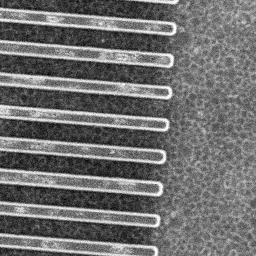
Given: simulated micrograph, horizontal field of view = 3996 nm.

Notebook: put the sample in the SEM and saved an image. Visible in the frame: parallel lines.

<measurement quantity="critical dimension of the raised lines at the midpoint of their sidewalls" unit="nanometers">171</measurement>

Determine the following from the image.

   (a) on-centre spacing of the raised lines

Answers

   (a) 501 nanometres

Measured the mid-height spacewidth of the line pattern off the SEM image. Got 20.9 px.